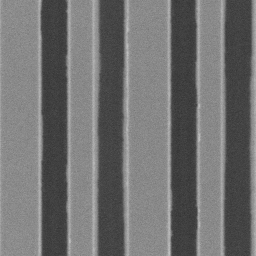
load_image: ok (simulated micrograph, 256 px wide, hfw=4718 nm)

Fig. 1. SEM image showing lines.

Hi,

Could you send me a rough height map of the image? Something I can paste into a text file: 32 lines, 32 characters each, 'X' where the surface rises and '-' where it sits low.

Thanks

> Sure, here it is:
XXXXX----XXX----XXXXX----XXX----
XXXXX----XXX----XXXXX----XXX----
XXXXX----XXX----XXXXX----XXX----
XXXXX----XXX----XXXXX----XXX----
XXXXX----XXX----XXXXX----XXX----
XXXXX----XXX----XXXXX----XXX----
XXXXX----XXX----XXXXX----XXX----
XXXXX----XXX----XXXXX----XXX----
XXXXX----XXX----XXXXX----XXX----
XXXXX----XXX----XXXXX----XXX----
XXXXX----XXX----XXXXX----XXX----
XXXXX----XXX----XXXXX----XXX----
XXXXX----XXX----XXXXX----XXX----
XXXXX----XXX----XXXXX----XXX----
XXXXX----XXX----XXXXX----XXX----
XXXXX----XXX----XXXXX----XXX----
XXXXX----XXX----XXXXX----XXX----
XXXXX----XXX----XXXXX----XXX----
XXXXX----XXX----XXXXX----XXX----
XXXXX----XXX----XXXXX----XXX----
XXXXX----XXX----XXXXX----XXX----
XXXXX----XXX----XXXXX----XXX----
XXXXX----XXX----XXXXX----XXX----
XXXXX----XXX----XXXXX----XXX----
XXXXX----XXX----XXXXX----XXX----
XXXXX----XXX----XXXXX----XXX----
XXXXX----XXX----XXXXX----XXX----
XXXXX----XXX----XXXXX----XXX----
XXXXX----XXX----XXXXX----XXX----
XXXXX----XXX----XXXXX----XXX----
XXXXX----XXX----XXXXX----XXX----
XXXXX----XXX----XXXXX----XXX----